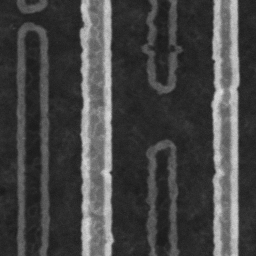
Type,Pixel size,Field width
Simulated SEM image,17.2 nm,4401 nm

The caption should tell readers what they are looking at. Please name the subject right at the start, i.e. one or a few lines or trenches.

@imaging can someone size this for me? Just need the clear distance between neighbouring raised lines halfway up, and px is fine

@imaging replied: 42.9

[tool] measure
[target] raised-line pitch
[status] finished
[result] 1110 nm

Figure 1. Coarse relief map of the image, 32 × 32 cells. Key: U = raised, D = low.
DDDUUDDDDDDUUDDDDDDUUUDDDDDUUDDD
DDDDDDDDDDDUUDDDDDDUUUDDDDDUUDDD
DDDDDDDDDDDUUDDDDDDUUUDDDDDUUDDD
DDDUDDDDDDDUUUDDDDDUUUDDDDDUUDDD
DDDUUDDDDDUUUDDDDDDUUUDDDDDUUDDD
DDDUUUDDDDDUUDDDDDDUUUDDDDDUUDDD
DDDUUUDDDDDUUUDDDDDUUUDDDDDUUDDD
DDDUUUDDDDDUUUDDDDDUUUDDDDDUUDDD
DDDUUUDDDDDUUUDDDDDUUUDDDDDUUDDD
DDDUUUDDDDDUUDDDDDDUUDDDDDDUUDDD
DDDUUUDDDDDUUDDDDDDUUUDDDDDUUDDD
DDDUUUDDDDDUUUDDDDDDDDDDDDDUUDDD
DDDUUUDDDDDUUDDDDDDDDDDDDDDUUDDD
DDDUUUDDDDDUUUDDDDDDDDDDDDDUUDDD
DDDUUUDDDDDUUUDDDDDDDDDDDDDUUDDD
DDDUUUDDDDDUUUDDDDDDDDDDDDDUUDDD
DDDUUUDDDDUUUUDDDDDDDDDDDDDUUDDD
DDDUUUDDDDDUUUDDDDDDDDDDDDDUUDDD
DDDUUUDDDDDUUUDDDDDDUUDDDDDUUDDD
DDDUUUDDDDDUUUDDDDDUUUDDDDDUUDDD
DDDUUUDDDDDUUUDDDDDUUUDDDDDUUDDD
DDDUUUDDDDDUUDDDDDDUUUDDDDDUUDDD
DDDUUUDDDDDUUUDDDDDUUUDDDDDUUDDD
DDDUUUDDDDDUUDDDDDDUUUDDDDDUUDDD
DDDUUUDDDDDUUUDDDDDUUUDDDDDUUDDD
DDDUUUDDDDDUUDDDDDDUUUDDDDDUUDDD
DDDUUUDDDDDUUUDDDDDUUUDDDDDUUDDD
DDDUUUDDDDDUUUDDDDDUUUDDDDDUUDDD
DDDUUUDDDDDUUUDDDDDUUUDDDDDUUDDD
DDDUUUDDDDDUUUDDDDDUUUDDDDDUUDDD
DDDUUUDDDDDUUUDDDDDUUUDDDDDUUDDD
DDDUUDDDDDDUUUDDDDDUUUDDDDDUUDDD